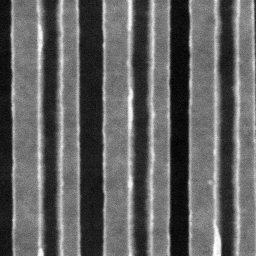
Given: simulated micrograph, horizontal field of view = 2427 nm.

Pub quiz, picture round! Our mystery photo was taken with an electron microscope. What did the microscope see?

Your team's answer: lines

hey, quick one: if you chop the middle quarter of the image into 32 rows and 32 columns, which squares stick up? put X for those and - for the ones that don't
XXX-------XXXXXX------XXXX-----X
XXX-------XXXXXX------XXXX------
XXXX------XXXXXX------XXXX------
XXX-------XXXXXX------XXXX------
XXX-------XXXXXX------XXXX-----X
XXX-------XXXXXX------XXXX-----X
XXX-------XXXXXXX-----XXXX-----X
XXX-------XXXXXXX-----XXXX------
XXX-------XXXXXXX-----XXXX------
XXX-------XXXXXXX-----XXXX-----X
XXX-------XXXXXXX-----XXXX-----X
XXX-------XXXXXXX-----XXXX-----X
XXX-------XXXXXXX-----XXXX-----X
XXX-------XXXXXXX-----XXXX-----X
XXX-------XXXXXXX-----XXXX-----X
XXXX------XXXXXXX-----XXXX-----X
XXXX------XXXXXX------XXXX-----X
XXXX------XXXXXX------XXXX-----X
XXX-------XXXXXX------XXXX-----X
XXXX------XXXXXX------XXXX-----X
XXXX------XXXXXX------XXXX-----X
XXXX------XXXXXX------XXXX-----X
XXXX------XXXXXX------XXXX-----X
XXXX------XXXXXX------XXXX-----X
XXXX------XXXXXX------XXXX-----X
XXXX------XXXXXX------XXXX-----X
XXXX------XXXXXX------XXXX-----X
XXXX------XXXXXX------XXXX-----X
XXXX------XXXXXXX-----XXXX-----X
XXXX------XXXXXXX-----XXXX-----X
XXXX------XXXXXXX-----XXXX-----X
XXXX------XXXXXXX-----XXXX-----X